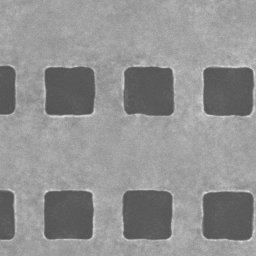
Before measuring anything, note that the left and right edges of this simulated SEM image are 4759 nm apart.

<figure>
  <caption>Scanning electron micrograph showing holes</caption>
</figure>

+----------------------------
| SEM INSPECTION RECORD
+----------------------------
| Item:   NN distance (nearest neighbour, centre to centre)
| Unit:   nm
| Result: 1470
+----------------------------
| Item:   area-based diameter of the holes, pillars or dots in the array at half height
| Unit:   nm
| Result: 1030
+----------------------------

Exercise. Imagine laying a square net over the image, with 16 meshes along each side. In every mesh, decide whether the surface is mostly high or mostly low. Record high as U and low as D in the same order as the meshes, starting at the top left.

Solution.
UUUUUUUUUUUUUUUU
UUUUUUUUUUUUUUUU
UUUUUUUUUUUUUUUU
UUUUUUUUUUUUUUUU
DUUDDDUUDDDUUDDD
DUUDDDUUDDDUUDDD
DUUDDDUUDDDUUDDD
UUUUUUUUUUUUUUUU
UUUUUUUUUUUUUUUU
UUUUUUUUUUUUUUUU
UUUUUUUUUUUUUUUU
UUUUUUUUUUUUUUUU
DUUDDDUUDDDUUDDD
DUUDDDUUDDDUUDDD
DUUDDDUUDDDUUDDD
UUUUUUUUUUUUUUUU